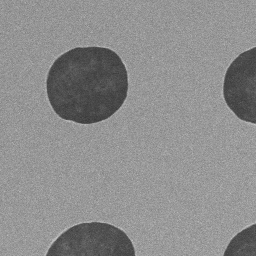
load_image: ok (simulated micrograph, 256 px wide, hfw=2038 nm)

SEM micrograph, holes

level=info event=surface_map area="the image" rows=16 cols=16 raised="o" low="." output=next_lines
oooooooooooooooo
oooooooooooooooo
oooooooooooooooo
oooo...oooooooo.
ooo.....oooooo..
ooo.....oooooo..
ooo.....oooooo..
oooo..ooooooooo.
oooooooooooooooo
oooooooooooooooo
oooooooooooooooo
oooooooooooooooo
oooooooooooooooo
oooooooooooooooo
oooo....ooooooo.
ooo.....oooooo..